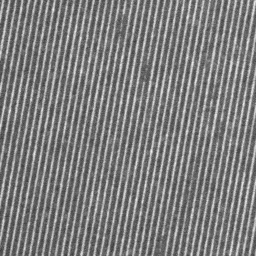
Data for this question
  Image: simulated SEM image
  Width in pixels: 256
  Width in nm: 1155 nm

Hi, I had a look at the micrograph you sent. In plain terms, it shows parallel lines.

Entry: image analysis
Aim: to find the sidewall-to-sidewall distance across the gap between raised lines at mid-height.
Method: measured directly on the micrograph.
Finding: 4.92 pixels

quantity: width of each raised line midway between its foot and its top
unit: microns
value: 0.0066